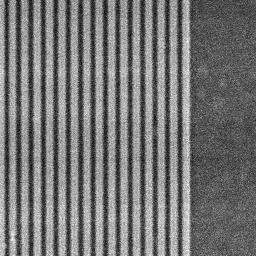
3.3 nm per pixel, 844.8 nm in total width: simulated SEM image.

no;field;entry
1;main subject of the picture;parallel lines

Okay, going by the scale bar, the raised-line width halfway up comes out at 20.2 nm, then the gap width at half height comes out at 20.2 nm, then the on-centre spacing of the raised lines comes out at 41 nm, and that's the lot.